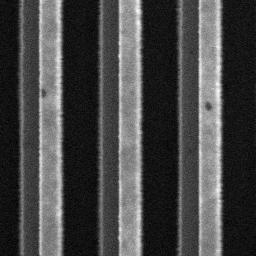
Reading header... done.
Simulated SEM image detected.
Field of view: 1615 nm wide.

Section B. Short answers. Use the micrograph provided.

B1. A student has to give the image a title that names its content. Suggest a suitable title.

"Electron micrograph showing lines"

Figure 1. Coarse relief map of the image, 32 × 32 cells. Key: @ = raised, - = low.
---@@@@@-----@@@@@-----@@@@@----
---@@@@@-----@@@@@-----@@@@@----
---@@@@@-----@@@@@-----@@@@@----
---@@@@@-----@@@@@-----@@@@@----
---@@@@@-----@@@@@-----@@@@@----
---@@@@@-----@@@@@----@@@@@@----
---@@@@@-----@@@@@-----@@@@@----
---@@@@@-----@@@@@-----@@@@@----
---@@@@@-----@@@@@-----@@@@@----
---@@@@@-----@@@@@-----@@@@@----
---@@@@@-----@@@@@-----@@@@@----
---@@@@@-----@@@@@-----@@@@@----
---@@@@@-----@@@@@----@@@@@@----
---@@@@@-----@@@@@-----@@@@@----
---@@@@@-----@@@@@-----@@@@@----
---@@@@@-----@@@@@-----@@@@@----
---@@@@@-----@@@@@----@@@@@@----
---@@@@@-----@@@@@-----@@@@@----
---@@@@@-----@@@@@-----@@@@@----
---@@@@@-----@@@@@----@@@@@@----
---@@@@@-----@@@@@----@@@@@@----
---@@@@@-----@@@@@-----@@@@@----
---@@@@@-----@@@@@-----@@@@@----
---@@@@@-----@@@@@----@@@@@@----
---@@@@@-----@@@@@----@@@@@@----
---@@@@@-----@@@@@----@@@@@@----
---@@@@@-----@@@@@----@@@@@@----
---@@@@@-----@@@@@----@@@@@@----
---@@@@@-----@@@@@----@@@@@@----
---@@@@@-----@@@@@----@@@@@@----
---@@@@@-----@@@@@----@@@@@@----
---@@@@@-----@@@@@----@@@@@@----